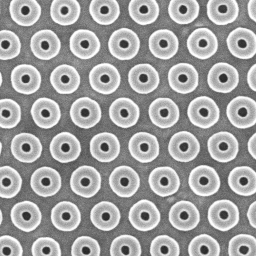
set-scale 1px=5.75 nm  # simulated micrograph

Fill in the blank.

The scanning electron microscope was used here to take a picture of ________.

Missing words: a regular array of ring-shaped raised bodies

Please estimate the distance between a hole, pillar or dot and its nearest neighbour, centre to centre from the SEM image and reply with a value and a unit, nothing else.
224 nanometers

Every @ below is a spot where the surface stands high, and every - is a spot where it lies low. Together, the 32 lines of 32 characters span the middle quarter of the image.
@-------@@@@------@@@@------@@@@
@@@----@@@@@@----@@@@@@----@@@@@
@@@----@@@@@@@--@@@-@@@---@@@-@@
-@@@---@@--@@@--@@@--@@---@@---@
-@@@---@@@-@@@--@@@--@@---@@@--@
@@@@---@@@@@@----@@@@@@----@@@@@
@@@-----@@@@@-----@@@@------@@@@
--------------------------------
--------------------------------
---@@@@@-----@@@@-----@@@@@-----
--@@@@@@@---@@@@@@----@@@@@@---@
--@@--@@@---@@--@@@--@@@--@@---@
--@@--@@@---@@--@@@--@@@--@@---@
--@@@@@@@---@@@@@@----@@@@@@----
--@@@@@@-----@@@@@----@@@@@@----
----@@@-------@@@-------@@@-----
--------------------------------
@--------@@-------@@@-------@@@@
@@@----@@@@@@----@@@@@@----@@@@@
@@@@---@@@@@@----@@@@@@---@@@@@@
-@@@---@@--@@@--@@@--@@@--@@@--@
-@@@---@@--@@@---@@--@@@--@@@--@
@@@@---@@@@@@----@@@@@@----@@@@@
@@@-----@@@@@-----@@@@@-----@@@@
--------------------------------
--------------------------------
---@@@@@-----@@@@------@@@@-----
--@@@@@@@---@@@@@@----@@@@@@----
--@@@-@@@--@@@--@@----@@--@@@--@
--@@---@@--@@@--@@@---@@--@@@--@
--@@@-@@@---@@@-@@@---@@@-@@@---
--@@@@@@----@@@@@@----@@@@@@----